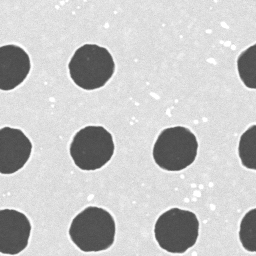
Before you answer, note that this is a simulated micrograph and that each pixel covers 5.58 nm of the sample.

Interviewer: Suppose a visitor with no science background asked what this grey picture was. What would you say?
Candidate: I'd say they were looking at holes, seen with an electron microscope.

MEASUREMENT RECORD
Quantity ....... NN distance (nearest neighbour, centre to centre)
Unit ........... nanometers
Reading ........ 456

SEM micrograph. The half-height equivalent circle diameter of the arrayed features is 252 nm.